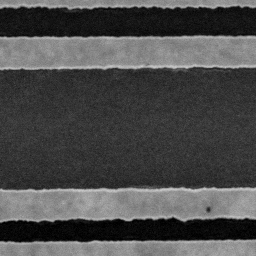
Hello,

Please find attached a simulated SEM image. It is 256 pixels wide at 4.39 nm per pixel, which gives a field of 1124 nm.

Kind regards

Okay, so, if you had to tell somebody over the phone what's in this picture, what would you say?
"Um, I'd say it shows lines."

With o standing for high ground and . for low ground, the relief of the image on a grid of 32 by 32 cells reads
oooooooooooooooooooooooooooooooo
................................
................................
................................
.......................ooooooooo
oooooooooooooooooooooooooooooooo
oooooooooooooooooooooooooooooooo
oooooooooooooooooooooooooooooooo
oooooooooooooooooo.o.o.o.....o..
................................
................................
................................
................................
................................
................................
................................
................................
................................
................................
................................
................................
................................
................................
......................o..oo...o.
oooooooooooooooooooooooooooooooo
oooooooooooooooooooooooooooooooo
oooooooooooooooooooooooooooooooo
ooooooooo..ooo.oo.....oo........
................................
................................
oooooooooooooooooooooooooooooooo
oooooooooooooooooooooooooooooooo